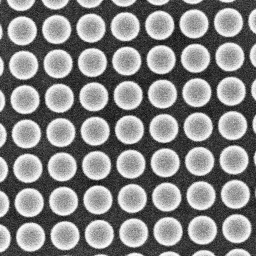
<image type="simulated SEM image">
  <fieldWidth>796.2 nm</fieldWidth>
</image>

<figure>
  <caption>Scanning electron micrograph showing an array of small figures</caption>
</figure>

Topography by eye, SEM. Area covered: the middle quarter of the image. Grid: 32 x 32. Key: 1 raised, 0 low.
11001111110011111110011111100011
11001111110001111100001111100001
10000111100000011000000000000000
00000000000000000000000000000000
00000000000000000000000111000001
10000111110001111110001111110011
11001111110001111110011111110011
11001111111001111110011111110011
11001111111001111110011111110011
11001111111001111110001111100001
11000111110000111100000111000000
10000011100000000000000000000000
00000000000000000000000000000000
00000011100000111100000111100001
10000111110000111110001111110011
11000111111001111111001111110011
11101111111001111111001111110011
11101111111001111111001111110001
11000111111000111110001111100000
11000111110000011100000000000000
00000000000000000000000000000000
00000000000000000000000011100000
10000011110000111110000111110001
11000111111000111111001111111001
11100111111001111111001111111011
11100111111101111111001111111001
11100111111000111111001111110001
11100111111000111110000111100000
10000001110000001000000000000000
00000000000000000000000000000000
00000000000000011100000011110000
11000011111000111111000111111001